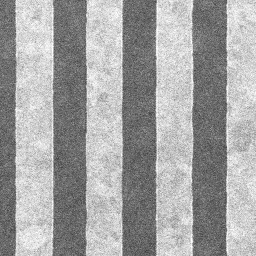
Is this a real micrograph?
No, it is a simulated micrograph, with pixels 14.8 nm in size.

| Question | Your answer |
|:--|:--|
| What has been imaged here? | one or a few lines or trenches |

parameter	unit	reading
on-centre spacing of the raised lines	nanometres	1040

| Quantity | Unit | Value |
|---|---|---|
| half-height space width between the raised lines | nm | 511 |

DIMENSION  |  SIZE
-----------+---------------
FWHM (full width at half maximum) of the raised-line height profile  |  524 nm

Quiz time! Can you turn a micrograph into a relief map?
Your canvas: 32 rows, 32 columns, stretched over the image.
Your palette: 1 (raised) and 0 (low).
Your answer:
00111110000111100000111100001111
00111110000111100000111100001111
00111100000111100000111100001111
00111100000111100000111100001111
00111100000111100000111100001111
00111100000111100000111100001111
00111100000111100000111100001111
00111100000111100000111100001111
00111100000111100000111100001111
00111100000111100000111100001111
00111100000111100000111100001111
00111100000111100000111100001111
00111100000111100000111100001111
00111100000111100000111100001111
00111100000111100000111100001111
00111100000111100000111100001111
00111100000111100000111100001111
00111100000111100000111100001111
00111100000111100000111100001111
00111110000111100000111100001111
00111100000111100000111100001111
00111100000111100000111100001111
00111100000111100000111100001111
00111100000111100000111100001111
00111100000111100000111100001111
00111100000111100000111100001111
00111100000111100000111100001111
00111100000111100000111100001111
00111100000111100000111100001111
00111100000111100000111100001111
00111100000111100000111100001111
00111100000111100000111100001111